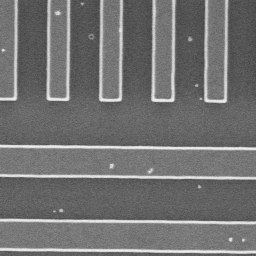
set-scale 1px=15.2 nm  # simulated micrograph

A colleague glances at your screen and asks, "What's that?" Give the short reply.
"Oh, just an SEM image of groups of lines, slits or small figures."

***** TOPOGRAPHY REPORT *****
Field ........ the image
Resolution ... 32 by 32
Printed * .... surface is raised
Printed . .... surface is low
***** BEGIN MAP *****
**....***....**....***....**....
**....***....**....***....**....
**....***....**....***....**....
**....***....**....***....**....
**....***....**....***....**....
**....**.....**....***....**....
**....**.....**....***....**....
**....**.....**....***....**....
**....**.....**....***....**....
**....**.....**....***....**....
**....**.....**....***....**....
**....**.....**....***....**....
.............**....**.....**....
................................
................................
................................
................................
................................
********************............
********************************
********************************
********************************
................................
................................
................................
................................
................................
................................
********************************
********************************
********************************
.............................**.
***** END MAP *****